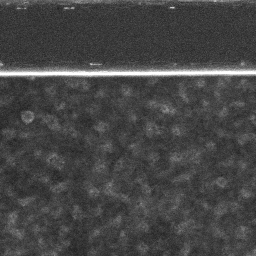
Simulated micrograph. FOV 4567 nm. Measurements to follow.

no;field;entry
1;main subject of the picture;one or a few lines or trenches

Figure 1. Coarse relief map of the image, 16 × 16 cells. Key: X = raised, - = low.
----------------
----------------
----------------
----------------
----------------
XXXXXXXXXXXXXXXX
XXXXXXXXXXXXXXXX
XXXXXXXXXXXXXXXX
XXXXXXXXXXXXXXXX
XXXXXXXXXXXXXXXX
XXXXXXXXXXXXXXXX
XXXXXXXXXXXXXXXX
XXXXXXXXXXXXXXXX
XXXXXXXXXXXXXXXX
XXXXXXXXXXXXXXXX
XXXXXXXXXXXXXXXX